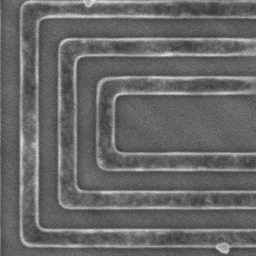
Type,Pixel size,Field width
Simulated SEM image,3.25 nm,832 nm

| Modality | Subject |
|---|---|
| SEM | groups of lines, slits or small figures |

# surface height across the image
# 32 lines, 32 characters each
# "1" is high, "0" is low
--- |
00011111111111111111111111111111
00011111111111111111111111111111
00011000000000000000000000000000
00011000000000000000000000000000
00011000000000000000000000000000
00011000111111111111111111111111
00011001111111111111111111111111
00011001110000000000000000000000
00011001100000000000000000000000
00011001100000000000000000000000
00011001100001111111111111111111
00011001100011111111111111111110
00011001100011000000000000000000
00011001110011000000000000000000
00011001110011000000000000000000
00011001100011000000000000000000
00011001100011000000000000000000
00011001100011000000000000000000
00011001110011000000000000000000
00011001110011111111111111111111
00011001100011111111111111111111
00011001100000000000000000000000
00011001110000000000000000000000
00011001110000000000000000000000
00011001111111111111111111111111
00011000111111111111111111111111
00011000000000000000000000000000
00011000000000000000000000000000
00011000000000000000000000000000
00011111111111111111111111111111
00011111111111111111111111111111
00000000000000000000000000000000